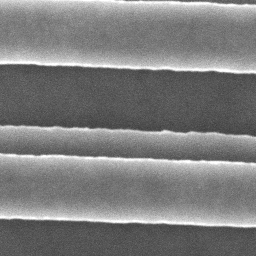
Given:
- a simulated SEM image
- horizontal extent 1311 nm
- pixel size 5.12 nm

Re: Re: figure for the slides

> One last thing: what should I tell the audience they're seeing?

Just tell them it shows lines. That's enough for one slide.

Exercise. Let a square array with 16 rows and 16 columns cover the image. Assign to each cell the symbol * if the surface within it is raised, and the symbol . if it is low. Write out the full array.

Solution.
****************
****************
****************
****************
...............*
................
................
................
................
................
****************
****************
****************
****************
................
................